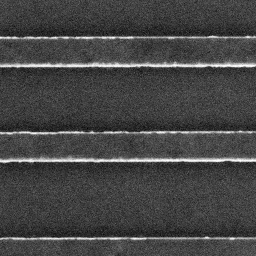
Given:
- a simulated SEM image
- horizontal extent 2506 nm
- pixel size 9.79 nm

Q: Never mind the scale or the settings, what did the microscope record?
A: lines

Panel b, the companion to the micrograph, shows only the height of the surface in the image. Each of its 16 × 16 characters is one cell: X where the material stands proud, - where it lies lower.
----------------
----------------
XXXXXXXXXXXXXXXX
XXXXXXXXXXXXXXXX
----------------
----------------
----------------
----------------
XXXXXXXXXXXXXXXX
XXXXXXXXXXXXXXXX
----------------
----------------
----------------
----------------
----------------
XXXXXXXXXXXXXXXX